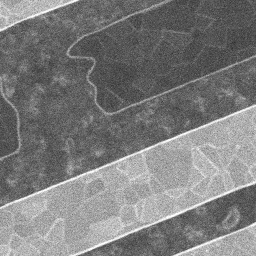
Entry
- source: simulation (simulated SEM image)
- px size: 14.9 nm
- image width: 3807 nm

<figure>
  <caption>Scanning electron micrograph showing one or a few lines or trenches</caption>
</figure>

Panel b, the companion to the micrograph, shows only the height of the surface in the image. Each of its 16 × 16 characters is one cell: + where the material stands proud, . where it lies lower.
+++......+++++++
+......+++++++++
.....+++++++++++
.....+++++++++++
......++++++++..
......+++++.....
+.....++........
+.............++
+..........+++++
+........+++++++
......++++++++++
....++++++++++++
.++++++++++++...
+++++++++++.....
++++++++.......+
++++++......++++